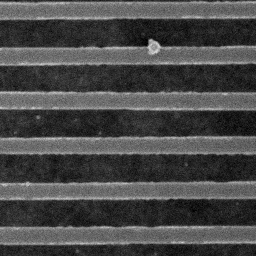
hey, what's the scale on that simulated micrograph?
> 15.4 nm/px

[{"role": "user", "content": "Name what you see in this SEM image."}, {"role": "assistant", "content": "lines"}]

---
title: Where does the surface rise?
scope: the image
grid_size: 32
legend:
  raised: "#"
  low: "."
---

################################
################################
................................
................................
................................
...................#............
################################
################################
................................
................................
................................
................................
################################
################################
................................
................................
................................
################################
################################
................................
................................
................................
................................
################################
################################
................................
................................
................................
################################
################################
................................
................................